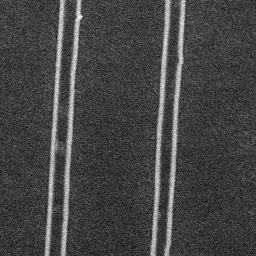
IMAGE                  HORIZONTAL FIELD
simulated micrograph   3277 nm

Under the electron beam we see one or a few lines or trenches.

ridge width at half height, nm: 206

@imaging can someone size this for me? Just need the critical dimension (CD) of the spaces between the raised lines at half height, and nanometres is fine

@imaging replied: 1140